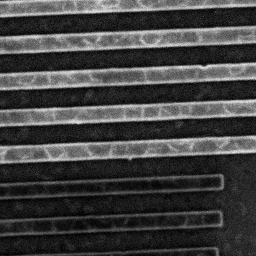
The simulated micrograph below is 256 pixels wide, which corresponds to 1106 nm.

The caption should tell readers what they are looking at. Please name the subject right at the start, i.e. parallel lines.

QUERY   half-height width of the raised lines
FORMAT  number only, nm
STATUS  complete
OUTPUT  62.6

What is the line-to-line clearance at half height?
95.6 nanometres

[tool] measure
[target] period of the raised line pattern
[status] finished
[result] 36.5 pixels